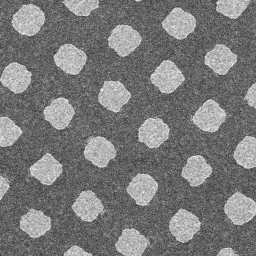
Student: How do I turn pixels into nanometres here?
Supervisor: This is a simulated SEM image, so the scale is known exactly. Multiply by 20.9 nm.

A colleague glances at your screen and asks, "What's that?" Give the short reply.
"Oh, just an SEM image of a regular array of raised bodies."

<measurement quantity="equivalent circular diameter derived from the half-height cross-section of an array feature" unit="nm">600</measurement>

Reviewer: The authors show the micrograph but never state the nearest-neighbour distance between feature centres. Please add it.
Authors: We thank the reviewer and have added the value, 1160 nm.